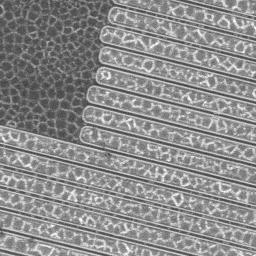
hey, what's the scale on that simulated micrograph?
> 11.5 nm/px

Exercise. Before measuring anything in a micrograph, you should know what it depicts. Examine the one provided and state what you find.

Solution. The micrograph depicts parallel lines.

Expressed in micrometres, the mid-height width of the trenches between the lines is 0.186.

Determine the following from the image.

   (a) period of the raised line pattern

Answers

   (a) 236 nanometres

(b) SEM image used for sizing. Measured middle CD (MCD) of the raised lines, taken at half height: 49 nm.